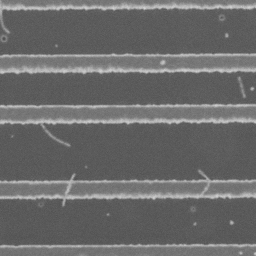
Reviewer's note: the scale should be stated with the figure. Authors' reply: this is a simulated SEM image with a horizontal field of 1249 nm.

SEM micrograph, lines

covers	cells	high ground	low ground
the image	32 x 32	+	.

++++++++++++++++++++++++++++++++
................................
................................
................................
................................
................................
................................
++++++++++++++++++++++++++++++++
++++++++++++++++++++++++++++++++
................................
................................
................................
................................
++++++++++++++++++++++++++++++++
++++++++++++++++++++++++++++++++
................................
................................
................................
................................
................................
................................
................................
.........................+......
++++++++++++++++++++++++++++++++
++++++++++++++++++++++++++++++++
................................
................................
................................
................................
................................
................................
++++++++++++++++++++++++++++++++